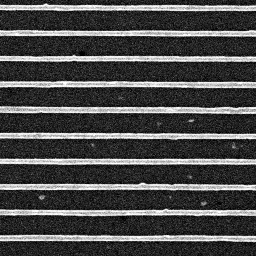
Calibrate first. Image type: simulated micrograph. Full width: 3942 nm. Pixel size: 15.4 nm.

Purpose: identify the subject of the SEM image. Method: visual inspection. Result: parallel lines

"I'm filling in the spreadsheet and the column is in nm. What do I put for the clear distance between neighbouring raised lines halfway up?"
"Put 320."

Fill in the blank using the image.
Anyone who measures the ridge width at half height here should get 4.75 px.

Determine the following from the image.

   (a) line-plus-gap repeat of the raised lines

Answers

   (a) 0.394 microns